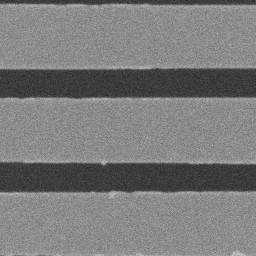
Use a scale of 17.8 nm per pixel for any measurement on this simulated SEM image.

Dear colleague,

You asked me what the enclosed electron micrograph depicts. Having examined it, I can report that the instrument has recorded lines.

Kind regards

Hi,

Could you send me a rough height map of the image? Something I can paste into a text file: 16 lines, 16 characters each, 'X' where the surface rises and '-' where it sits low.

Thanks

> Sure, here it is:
XXXXXXXXXXXXXXXX
XXXXXXXXXXXXXXXX
XXXXXXXXXXXXXXXX
XXXXXXXXXXXXXXXX
----------------
----------------
XXXXXXXXXXXXXXXX
XXXXXXXXXXXXXXXX
XXXXXXXXXXXXXXXX
XXXXXXXXXXXXXXXX
----------------
----------------
XXXXXXXXXXXXXXXX
XXXXXXXXXXXXXXXX
XXXXXXXXXXXXXXXX
XXXXXXXXXXXXXXXX